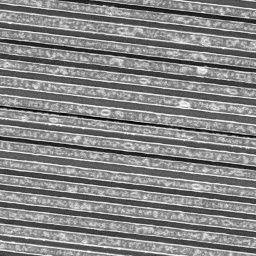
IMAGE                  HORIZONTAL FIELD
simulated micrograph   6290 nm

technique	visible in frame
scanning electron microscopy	parallel lines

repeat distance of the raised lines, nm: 400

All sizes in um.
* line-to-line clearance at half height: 0.152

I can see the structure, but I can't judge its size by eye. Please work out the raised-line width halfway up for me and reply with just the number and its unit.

241 nanometres